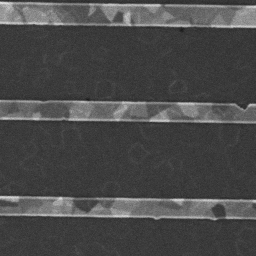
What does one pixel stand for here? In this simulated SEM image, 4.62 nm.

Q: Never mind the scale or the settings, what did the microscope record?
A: one or a few lines or trenches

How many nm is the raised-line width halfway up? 84.8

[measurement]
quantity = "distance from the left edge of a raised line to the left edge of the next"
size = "445 nanometers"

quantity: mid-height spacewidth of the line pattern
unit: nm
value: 360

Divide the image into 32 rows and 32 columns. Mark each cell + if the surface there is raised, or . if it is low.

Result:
+++++++.........................
++++++++++++++++++++++++++++++++
++++++++++++++++++++++++++++++++
................................
................................
................................
................................
................................
................................
................................
................................
................................
................................
++++++++++++++++++++++++++++++.+
++++++++++++++++++++++++++++++++
................................
................................
................................
................................
................................
................................
................................
................................
................................
................................
++++++++++++++++++++++++++++++++
++++++++++++++++++++++++++++++++
................................
................................
................................
................................
................................